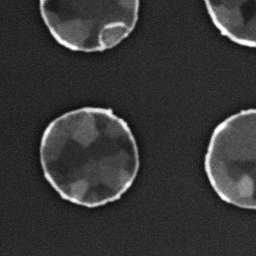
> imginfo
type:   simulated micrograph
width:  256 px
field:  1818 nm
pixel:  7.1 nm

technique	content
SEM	raised bodies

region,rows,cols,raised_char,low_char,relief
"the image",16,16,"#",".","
...######....###
...#####......##
....##.........#
................
................
................
................
....####......##
...#####.....###
...######....###
...######....###
...#####.....###
....###.......##
................
................
................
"